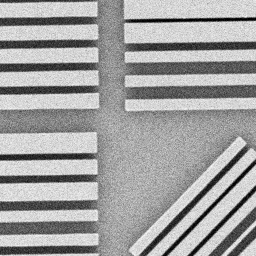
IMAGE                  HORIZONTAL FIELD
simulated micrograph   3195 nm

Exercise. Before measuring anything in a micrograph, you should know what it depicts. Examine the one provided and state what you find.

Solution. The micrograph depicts groups of lines, slits or small figures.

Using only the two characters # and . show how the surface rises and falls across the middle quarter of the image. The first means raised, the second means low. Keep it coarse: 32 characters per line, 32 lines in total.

................................
................................
########........................
########.......#################
########.......#################
...............######...........
................................
...#####........................
#########.......................
#########......#################
#########......#################
................#...............
................................
................................
................................
................................
................................
########........................
########........................
########........................
########........................
########........................
................................
................................
########........................
########........................
########........................
#...............................
................................
................................
########........................
########.......................#